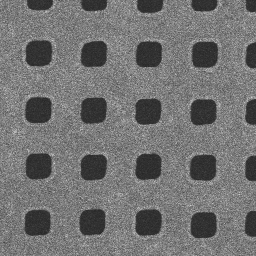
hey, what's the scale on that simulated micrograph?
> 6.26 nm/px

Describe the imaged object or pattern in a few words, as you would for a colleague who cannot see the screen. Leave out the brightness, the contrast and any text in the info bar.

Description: a regular array of holes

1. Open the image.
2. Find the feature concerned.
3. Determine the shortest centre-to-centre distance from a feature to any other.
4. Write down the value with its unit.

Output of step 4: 344 nanometers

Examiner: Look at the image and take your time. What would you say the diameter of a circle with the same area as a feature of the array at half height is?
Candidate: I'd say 172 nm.